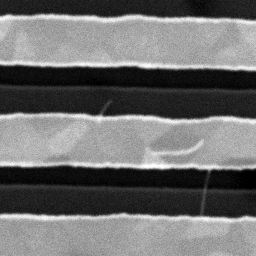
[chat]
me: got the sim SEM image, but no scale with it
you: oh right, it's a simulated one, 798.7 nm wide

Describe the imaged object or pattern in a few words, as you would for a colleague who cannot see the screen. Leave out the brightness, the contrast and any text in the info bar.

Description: lines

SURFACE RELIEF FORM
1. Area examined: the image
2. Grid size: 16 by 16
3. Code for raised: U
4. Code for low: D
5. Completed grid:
DDDDDDDDDDDDDDDD
UUUUUUUUUUUUUUUU
UUUUUUUUUUUUUUUU
UUUUUUUUUUUUUUUU
DDDDDDDDDDDDDDDD
DDDDDDDDDDDDDDDD
DDDDDDDDDDDDDDDD
UUUUUUUUUUUUUUUU
UUUUUUUUUUUUUUUU
UUUUUUUUUUUUUUUU
DDDDDDDDDDUDUUUU
DDDDDDDDDDDDDDDD
DDDDDDDDDDDDDDDD
UUUDDDUUUUDDDDDD
UUUUUUUUUUUUUUUU
UUUUUUUUUUUUUUUU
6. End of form